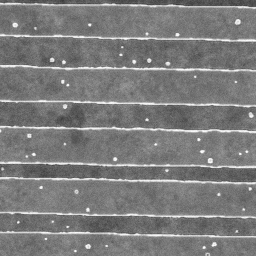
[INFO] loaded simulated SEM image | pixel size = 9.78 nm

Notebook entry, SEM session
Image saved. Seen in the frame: lines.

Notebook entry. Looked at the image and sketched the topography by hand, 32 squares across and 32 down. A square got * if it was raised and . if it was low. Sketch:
***.............................
********************************
********************************
********************************
..******************************
................................
................................
................................
********..*.**.*................
********************************
********************************
********************************
********************************
................................
................................
................................
********************************
********************************
********************************
********************************
...........*********************
................................
***************.................
********************************
********************************
********************************
********************************
................................
................................
**********************..........
********************************
********************************